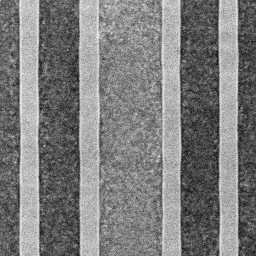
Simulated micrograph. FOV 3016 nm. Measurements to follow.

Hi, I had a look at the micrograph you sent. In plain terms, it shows groups of lines, slits or small figures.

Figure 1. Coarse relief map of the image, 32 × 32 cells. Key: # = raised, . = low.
...##.....##........##.....###..
...##.....##........##.....###..
...##.....##........##.....###..
...##.....##........##.....###..
...##.....##........##.....###..
...##.....##........##.....###..
...##.....##........##.....###..
...##.....##........##.....###..
...##.....##........##.....###..
...##.....##........##......##..
...##.....##........##......##..
...##.....##........##.....###..
...##.....##........##.....###..
...##.....##........##......##..
...##.....##........##......##..
...##.....##........##......##..
...##.....##........###.....##..
...##.....##........###.....##..
...##.....##........###.....##..
...##.....##........###....###..
...##.....##........##.....###..
...##.....##........##.....###..
...##.....##........##.....###..
...##.....##........##.....###..
...##.....##........##......##..
...##.....##........##......##..
...##.....##........##......##..
...##.....##........##......##..
...##.....##........##......##..
...##.....##........##......##..
...##.....##........###.....##..
...##.....##........###.....##..